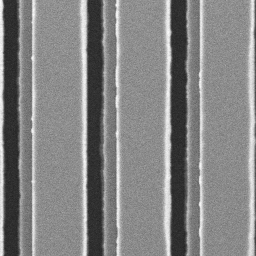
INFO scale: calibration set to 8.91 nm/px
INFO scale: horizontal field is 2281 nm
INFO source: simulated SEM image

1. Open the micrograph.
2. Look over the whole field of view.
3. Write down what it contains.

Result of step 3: lines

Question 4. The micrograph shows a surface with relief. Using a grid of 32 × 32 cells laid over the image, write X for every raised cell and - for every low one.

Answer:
--XXXXXXXXX--XXXXXXXX---XXXXXXXX
--XXXXXXXXX--XXXXXXXX--XXXXXXXXX
--XXXXXXXXX--XXXXXXXX--XXXXXXXXX
---XXXXXXXX--XXXXXXXX--XXXXXXXXX
--XXXXXXXXX--XXXXXXXX---XXXXXXXX
--XXXXXXXXX--XXXXXXXX---XXXXXXXX
--XXXXXXXXX--XXXXXXXX---XXXXXXXX
--XXXXXXXXX--XXXXXXXX--XXXXXXXXX
--XXXXXXXXX--XXXXXXXX--XXXXXXXXX
--XXXXXXXXX--XXXXXXXX---XXXXXXXX
--XXXXXXXXX--XXXXXXXX--XXXXXXXXX
--XXXXXXXXX--XXXXXXXX--XXXXXXXXX
--XXXXXXXXX--XXXXXXXX--XXXXXXXXX
--XXXXXXXXX--XXXXXXXX---XXXXXXXX
--XXXXXXXXX--XXXXXXXX---XXXXXXXX
---XXXXXXXX--XXXXXXXX--XXXXXXXXX
---XXXXXXXX--XXXXXXXX--XXXXXXXXX
--XXXXXXXXX--XXXXXXXX--XXXXXXXXX
--XXXXXXXXX--XXXXXXXX--XXXXXXXXX
--XXXXXXXXX--XXXXXXXX--XXXXXXXXX
--XXXXXXXXX--XXXXXXXX--XXXXXXXXX
--XXXXXXXXX--XXXXXXXX--XXXXXXXXX
--XXXXXXXXX--XXXXXXXX---XXXXXXXX
---XXXXXXXX--XXXXXXXX---XXXXXXXX
---XXXXXXXX--XXXXXXXX---XXXXXXXX
---XXXXXXXX--XXXXXXXX--XXXXXXXXX
---XXXXXXXX--XXXXXXXX--XXXXXXXXX
---XXXXXXXX--XXXXXXXX--XXXXXXXXX
---XXXXXXXX--XXXXXXXX--XXXXXXXXX
---XXXXXXXX--XXXXXXXX--XXXXXXXXX
---XXXXXXXX--XXXXXXXX--XXXXXXXXX
---XXXXXXXX--XXXXXXXX--XXXXXXXXX